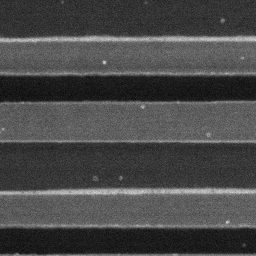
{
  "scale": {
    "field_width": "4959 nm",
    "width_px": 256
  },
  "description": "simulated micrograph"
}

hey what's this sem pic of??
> lines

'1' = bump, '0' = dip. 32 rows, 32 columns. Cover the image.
00000000000000000000000000000000
00000000000000000000000000000000
00000000000000000000000000000000
00000000000000000000000000000000
00000000000000000000000000000000
11111111111111111111111111111111
11111111111111111111111111111111
11111111111111111111111111111111
11111111111111111111111111111111
00000000000000000000000000000000
00000000000000000000000000000000
00000000000000000000000000000000
00000000000000000000000000000000
11111111111111111111111111111111
11111111111111111111111111111111
11111111111111111111111111111111
11111111111111111111111111111111
11111111111111111111111111111111
00000000000000000000000000000000
00000000000000000000000000000000
00000000000000000000000000000000
00000000000000000000000000000000
00000000000000000000000000000000
00000000000000000000000000000000
11111111111111111111111111111111
11111111111111111111111111111111
11111111111111111111111111111111
11111111111111111111111111111111
00000000000000000000000000000000
00000000000000000000000000000000
00000000000000000000000000000000
00000000000000000000000000000000